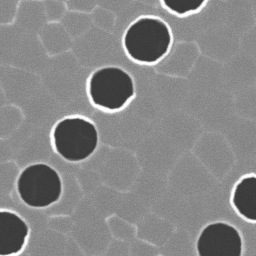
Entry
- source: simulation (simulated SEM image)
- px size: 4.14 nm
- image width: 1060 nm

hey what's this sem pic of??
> holes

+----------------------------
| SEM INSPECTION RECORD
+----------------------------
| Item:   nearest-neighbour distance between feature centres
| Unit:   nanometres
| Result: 247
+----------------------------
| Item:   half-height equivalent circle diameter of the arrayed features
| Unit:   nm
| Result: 177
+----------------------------